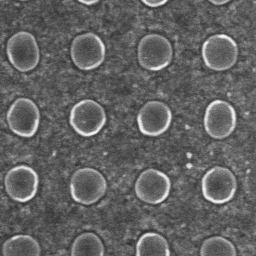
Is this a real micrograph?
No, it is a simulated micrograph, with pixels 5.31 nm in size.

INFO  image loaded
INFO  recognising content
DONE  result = a regular array of raised bodies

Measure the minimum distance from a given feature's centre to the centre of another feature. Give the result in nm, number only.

346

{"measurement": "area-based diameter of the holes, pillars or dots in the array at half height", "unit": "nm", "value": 183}